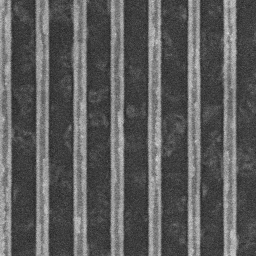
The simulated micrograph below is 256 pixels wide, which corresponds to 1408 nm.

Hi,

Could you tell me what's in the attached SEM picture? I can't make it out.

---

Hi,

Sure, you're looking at parallel lines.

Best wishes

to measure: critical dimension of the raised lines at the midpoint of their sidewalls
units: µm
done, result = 0.0564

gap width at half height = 150 nm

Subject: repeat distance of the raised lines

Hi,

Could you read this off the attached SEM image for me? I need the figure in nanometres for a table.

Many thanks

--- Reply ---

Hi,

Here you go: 206